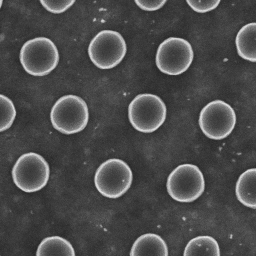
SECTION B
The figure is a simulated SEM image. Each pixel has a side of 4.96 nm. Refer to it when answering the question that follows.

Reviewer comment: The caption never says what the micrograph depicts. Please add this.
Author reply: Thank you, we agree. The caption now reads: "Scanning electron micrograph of a regular array of raised bodies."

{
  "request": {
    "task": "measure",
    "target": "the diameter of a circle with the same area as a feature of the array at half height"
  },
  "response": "180 nm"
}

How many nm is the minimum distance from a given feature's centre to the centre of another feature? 335